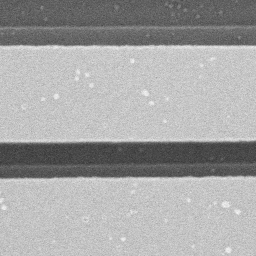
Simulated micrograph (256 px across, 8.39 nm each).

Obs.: lines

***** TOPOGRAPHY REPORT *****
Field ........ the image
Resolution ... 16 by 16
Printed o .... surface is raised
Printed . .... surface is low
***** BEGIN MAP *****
................
................
................
oooooooooooooooo
oooooooooooooooo
oooooooooooooooo
oooooooooooooooo
oooooooooooooooo
oooooooooooooooo
................
................
oooooooooooooooo
oooooooooooooooo
oooooooooooooooo
oooooooooooooooo
oooooooooooooooo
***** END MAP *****